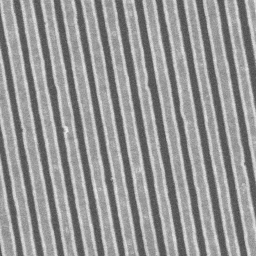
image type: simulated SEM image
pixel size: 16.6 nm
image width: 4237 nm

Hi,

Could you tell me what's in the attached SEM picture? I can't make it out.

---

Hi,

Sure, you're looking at parallel lines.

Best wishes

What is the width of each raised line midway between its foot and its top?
161 nm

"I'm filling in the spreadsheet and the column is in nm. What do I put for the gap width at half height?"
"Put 161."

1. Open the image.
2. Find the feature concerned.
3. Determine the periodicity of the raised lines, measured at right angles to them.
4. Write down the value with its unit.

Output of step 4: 20.1 px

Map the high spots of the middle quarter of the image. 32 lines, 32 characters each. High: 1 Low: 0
00111001110001100011000110001100
00111000110001100011000110001110
00011000110001110011000111001110
00011000111001110011100111001110
00011100111001110001100011000110
10011100111001110001100011000110
10011100011000110001100011000110
10001100011000110001100011100111
10001100011000111001100011100111
10001100011100111001110011100111
11001110011100111000110001100111
11001110011100011000110001100111
11001110001100011000110001100011
11000110001100011000110001100011
11000110001100011100110001110011
11000111001110011100011001110001
01100111001110011100011000110001
11100111001110001100011000110001
01100111000110001100011000111001
01100011000110001100011000111001
01100011000111001110011000111001
01100011100111001110001100011001
01110011100111001110001100011000
01110011100111000110001100011000
01110001100011000110001100011100
00110001100011000111001100011100
00110001100011100111000110011100
00110001110011100111000110001100
00111001110011100111000110001100
00011001110001100011000110001100
00011000110001100011000110001100
00011000110001100011100110001110